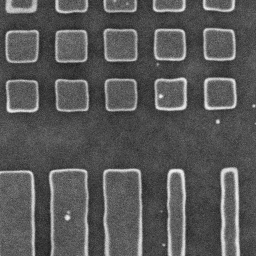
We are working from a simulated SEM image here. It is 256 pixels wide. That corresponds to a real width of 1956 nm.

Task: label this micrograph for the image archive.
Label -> groups of lines, slits or small figures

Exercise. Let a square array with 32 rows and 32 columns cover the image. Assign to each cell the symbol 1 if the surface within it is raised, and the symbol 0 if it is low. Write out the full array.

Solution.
01110001111001111001111000111000
00000000110000000000000000000000
00000000000000000000000000000000
00000000000000000000000000000000
01111001111001111001111000111000
01111001111001111001111000111000
01111001111001111001111000111000
01110001111000111000000000000000
00000000000000000000000000000000
00000000000000000000000000000000
01111001111001111001111000111000
01111001111001111000111000111000
01111001111001111000111000111000
01111001111001111000111000000000
00000000000000000000000000000000
00000000000000000000000000000000
00000000000000000000000000000000
00000000000000000000000000000000
00000000000000000000000000000000
00000000000000000000000000000000
00000000000000000000000000000000
01110001111001111000011000001000
11110011111001111100011000001100
11110011111001111100011000001100
11110001111001111100011000001100
11110011111001111100011000001100
11110001111001111100011000001100
11110001111001111100011000001100
11110001111001111100011000001100
11110001111001111100011000001100
11110001111001111100011000001100
11110011111001111100011000001100